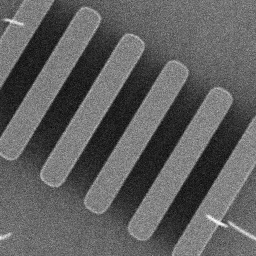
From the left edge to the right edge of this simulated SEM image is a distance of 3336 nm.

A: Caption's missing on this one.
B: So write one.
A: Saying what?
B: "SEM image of groups of lines, slits or small figures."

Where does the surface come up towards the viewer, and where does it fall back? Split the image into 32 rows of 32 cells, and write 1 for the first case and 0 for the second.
00011100000000000000000000000000
00111100001100000000000000000000
01111000011110000000000000000000
01111000111100000000000000000000
11110000111100001000000000000000
11100001111000011100000000000000
11100001110000111100000000000000
11000011110000111000000000000000
11000111100001111000111000000000
10000111000011110000111000000000
00001111000011100001111000000000
00001110000111100001110000110000
00011110000111000011110000111000
00111100001111000111100001111000
00111000011110000111000011110000
01111000011100001111000011100001
01110000111100001110000111100001
11110001111000011110000111000011
11100001111000111100001111000111
11000011110000111000011110000111
00000011100001111000011100001111
00000111100001110000111100001110
00000111000011110001111000011110
00000000000111100001111000111100
00000000000111000011110000111000
00000000000111000011100001111000
00000000000010000111100001110000
00000000000000001111000011110000
00000000000000001110000111100000
00000000000000000110000111000000
00000000000000000000001111000000
00000000000000000000001110000000